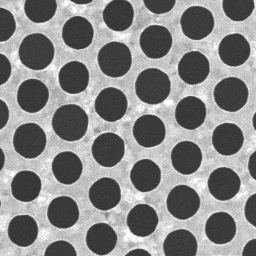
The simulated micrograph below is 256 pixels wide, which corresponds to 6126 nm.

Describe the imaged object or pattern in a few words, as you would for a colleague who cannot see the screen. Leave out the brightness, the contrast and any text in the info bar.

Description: a regular array of holes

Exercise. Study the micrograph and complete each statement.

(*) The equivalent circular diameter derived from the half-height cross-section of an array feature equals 33.2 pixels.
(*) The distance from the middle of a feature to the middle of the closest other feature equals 1.07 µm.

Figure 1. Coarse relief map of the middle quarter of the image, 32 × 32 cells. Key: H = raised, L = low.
LLLLLHHHHLLLLLLLLHHHHHHHHHHHLLLL
LLLLLLHHHLLLLLLLHHHHLLLLHHHHLLLL
LLLLLLHHHHLLLLLHHHHLLLLLLLHHLLLL
LLLLLLHHHHHHHHHHHHLLLLLLLLHHHLLL
LLLLLLHHHHHHHHHHHHLLLLLLLLLHHHLL
LLLLLLHHHHHHHHHHHHLLLLLLLLLHHHHH
LLLLLHHHHLLLLLHHHHLLLLLLLLLHHHHH
HLLHHHHHHLLLLLLHHHLLLLLLLLHHHHHH
HHHHHHHHLLLLLLLLHHHLLLLLLLHHHHLL
HHHHHHHHLLLLLLLLHHHHLLLLLHHHHLLL
LLLLHHHHLLLLLLLLHHHHHHHHHHHHLLLL
LLLLLHHHLLLLLLLLHHHHHHHHHHHHLLLL
LLLLLLHHLLLLLLLHHHHHHHHHHHHHLLLL
LLLLLLHHHLLLLLHHHHHLLLLLHHHHLLLL
LLLLLLHHHHHLLHHHHHLLLLLLLHHHLLLL
LLLLLLHHHHHHHHHHHLLLLLLLLHHHHLLL
LLLLLLHHHHHHHHHHHLLLLLLLLHHHHHHL
LLLLLHHHHLLLLHHHHLLLLLLLLLHHHHHH
LLLLHHHHLLLLLLHHHHLLLLLLLHHHHHHH
HHHHHHHLLLLLLLLHHHLLLLLLLHHHHLLL
HHHHHHHLLLLLLLLHHHHLLLLHHHHHLLLL
HHHHHHHLLLLLLLLHHHHHHHHHHHHLLLLL
LLLHHHHLLLLLLLLHHHHHHHHHHHHLLLLL
LLLLHHHLLLLLLLLHHHHHHHHHHHHLLLLL
LLLLHHHHLLLLLLHHHHLLLLLHHHHLLLLL
LLLLLHHHHLLLLHHHHLLLLLLLHHHLLLLL
LLLLLHHHHHHHHHHHHLLLLLLLHHHHLLLL
LLLLHHHHHHHHHHHHLLLLLLLLHHHHHHLL
LLLLHHHHHLLLHHHHHLLLLLLLHHHHHHHH
LLLHHHHHLLLLLHHHHLLLLLLLHHHHHHHH
HHHHHHHLLLLLLLHHHLLLLLLHHHHHLLLH
HHHHHHLLLLLLLLHHHHLLLLHHHHHLLLLL